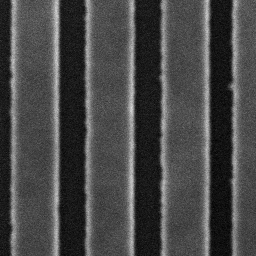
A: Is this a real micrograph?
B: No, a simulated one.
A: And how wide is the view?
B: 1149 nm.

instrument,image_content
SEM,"lines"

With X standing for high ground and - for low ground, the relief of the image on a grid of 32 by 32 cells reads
--XXXXX----XXXXXX---XXXXXX---XXX
--XXXXX----XXXXXX---XXXXXX---XXX
--XXXXX----XXXXXX---XXXXXX---XXX
--XXXXX----XXXXXX---XXXXXX---XXX
--XXXXX----XXXXXX---XXXXXX---XXX
--XXXXX----XXXXXX---XXXXXX---XXX
--XXXXX----XXXXXX---XXXXXX---XXX
-XXXXXX----XXXXXX---XXXXXX---XXX
-XXXXXX----XXXXXX---XXXXXX---XXX
--XXXXX----XXXXXX---XXXXXX---XXX
-XXXXXX----XXXXXX---XXXXXX---XXX
--XXXXX----XXXXXX---XXXXXX---XXX
--XXXXX----XXXXXX---XXXXXX---XXX
--XXXXX----XXXXXX---XXXXXX---XXX
--XXXXX----XXXXXX---XXXXXX---XXX
--XXXXX----XXXXXX---XXXXXX---XXX
--XXXXX----XXXXXX---XXXXXX---XXX
--XXXXX----XXXXXX---XXXXXX---XXX
--XXXXX----XXXXXX---XXXXXX---XXX
-XXXXXX----XXXXXX---XXXXXX---XXX
-XXXXXX----XXXXXX---XXXXXX---XXX
--XXXXX----XXXXXX---XXXXXX---XXX
--XXXXX----XXXXXX---XXXXXX---XXX
-XXXXXX----XXXXXX---XXXXXX---XXX
--XXXXX----XXXXXX---XXXXXX---XXX
--XXXXX----XXXXXX---XXXXXX---XXX
-XXXXXX----XXXXXX---XXXXXX---XXX
--XXXXX----XXXXXX---XXXXXX---XXX
--XXXXX----XXXXXX---XXXXXX---XXX
--XXXXX----XXXXXX---XXXXXX---XXX
-XXXXXX----XXXXXX---XXXXXX---XXX
--XXXXX----XXXXXX---XXXXXX---XXX